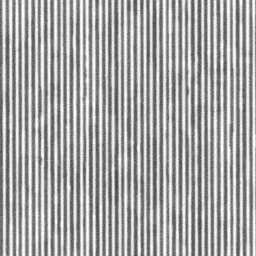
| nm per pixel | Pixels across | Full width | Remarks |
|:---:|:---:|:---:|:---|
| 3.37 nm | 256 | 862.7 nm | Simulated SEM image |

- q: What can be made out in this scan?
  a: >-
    parallel lines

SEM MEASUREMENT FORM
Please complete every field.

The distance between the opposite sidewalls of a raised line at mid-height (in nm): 6.3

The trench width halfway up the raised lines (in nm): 16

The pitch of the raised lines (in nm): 21.6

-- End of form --